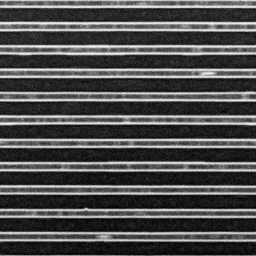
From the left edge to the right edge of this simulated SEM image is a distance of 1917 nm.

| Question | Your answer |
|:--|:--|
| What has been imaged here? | parallel lines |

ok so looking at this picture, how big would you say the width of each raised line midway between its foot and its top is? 57.1 nm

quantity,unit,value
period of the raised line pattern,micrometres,0.175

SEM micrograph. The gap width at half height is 114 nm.